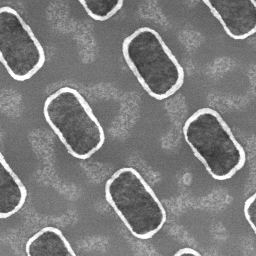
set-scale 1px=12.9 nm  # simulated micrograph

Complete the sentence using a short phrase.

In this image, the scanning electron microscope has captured raised bodies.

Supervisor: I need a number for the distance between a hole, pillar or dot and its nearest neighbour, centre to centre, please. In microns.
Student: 1.27